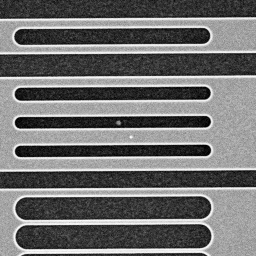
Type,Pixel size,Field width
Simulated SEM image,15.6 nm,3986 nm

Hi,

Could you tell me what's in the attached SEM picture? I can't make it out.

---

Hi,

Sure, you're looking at groups of lines, slits or small figures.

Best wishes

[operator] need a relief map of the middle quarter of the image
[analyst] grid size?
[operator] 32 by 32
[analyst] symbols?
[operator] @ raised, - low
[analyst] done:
--------------------------------
--------------------------------
--------------------------------
@@@@@@@@@@@@@@@@@@@@@@@@@@@@@@@@
@@@@@@@@@@@@@@@@@@@@@@@@@@@@@@@@
@@@@@@@@@@@@@@@@@@@@@@@@@@@@----
--------------------------------
--------------------------------
--------------------------------
@@@@@@@@@@@@@@@@@@@@@@@@@@@@@@@@
@@@@@@@@@@@@@@@@@@@@@@@@@@@@@@@@
@@@@@@@@@@@@@@@@@@@@@@@@@@@@@@@@
@@@@@@@@@@@@@@@@@@@@@@@@@@@@@@@@
--------------------------------
--------------------------------
--------------------------------
@@@@@@@@@@@@@@@@@@@@@@@@@@@@@@@@
@@@@@@@@@@@@@@@@@@@@@@@@@@@@@@@@
@@@@@@@@@@@@@@@@@@@@@@@@@@@@@@@@
@@@@@@@@@@@@@@@@@@@@@@@@@@@@@@@@
--------------------------------
--------------------------------
--------------------------------
@@@@@@@@@@@@@@@@@@@@@@@@@@@@@@@@
@@@@@@@@@@@@@@@@@@@@@@@@@@@@@@@@
@@@@@@@@@@@@@@@@@@@@@@@@@@@@@@@@
@@@@@@@@@@@@@@@@@@@@@@@@@@@@@@@@
--------------------------------
--------------------------------
--------------------------------
--------------------------------
@@@@@@@@@@@@@@@@@@@@@@@@@@@@@@@@